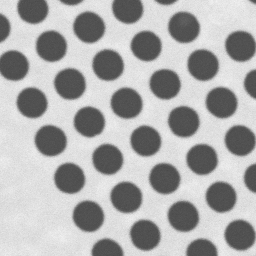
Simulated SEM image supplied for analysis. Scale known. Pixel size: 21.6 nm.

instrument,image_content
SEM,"a regular array of holes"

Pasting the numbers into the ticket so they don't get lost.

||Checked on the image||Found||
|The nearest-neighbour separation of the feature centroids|0.911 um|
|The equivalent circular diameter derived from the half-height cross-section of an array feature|0.687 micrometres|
